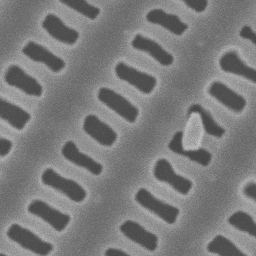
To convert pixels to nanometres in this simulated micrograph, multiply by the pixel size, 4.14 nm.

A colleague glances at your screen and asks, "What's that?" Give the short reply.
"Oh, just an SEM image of a regular array of holes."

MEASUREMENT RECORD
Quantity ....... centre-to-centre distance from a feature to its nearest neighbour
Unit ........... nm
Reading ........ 131